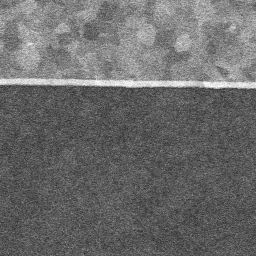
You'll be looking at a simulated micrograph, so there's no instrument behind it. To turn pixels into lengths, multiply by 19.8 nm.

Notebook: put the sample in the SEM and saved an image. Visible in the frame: one or a few lines or trenches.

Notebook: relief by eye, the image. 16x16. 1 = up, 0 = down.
1111111111111111
1111111111111111
1111111111111111
1111111111111111
1111111111111111
0000000000000000
0000000000000000
0000000000000000
0000000000000000
0000000000000000
0000000000000000
0000000000000000
0000000000000000
0000000000000000
0000000000000000
0000000000000000